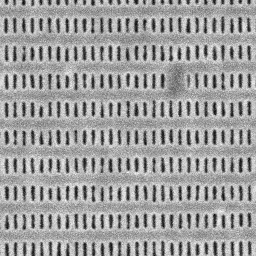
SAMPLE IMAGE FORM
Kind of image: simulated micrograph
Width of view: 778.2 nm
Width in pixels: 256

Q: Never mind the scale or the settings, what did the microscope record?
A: a regular array of holes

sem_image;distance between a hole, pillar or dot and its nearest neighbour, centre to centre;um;0.0258